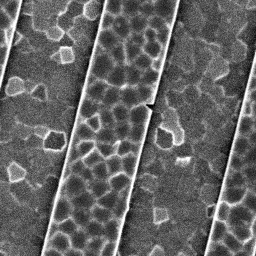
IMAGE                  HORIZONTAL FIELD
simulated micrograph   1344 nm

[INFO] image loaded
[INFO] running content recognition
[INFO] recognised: one or a few lines or trenches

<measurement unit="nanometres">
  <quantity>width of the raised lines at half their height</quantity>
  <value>373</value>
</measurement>